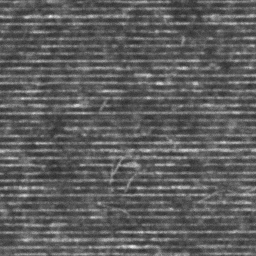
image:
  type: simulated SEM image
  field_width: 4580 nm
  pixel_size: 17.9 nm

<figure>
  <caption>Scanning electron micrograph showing parallel lines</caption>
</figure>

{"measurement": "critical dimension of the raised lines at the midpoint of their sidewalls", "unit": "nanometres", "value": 24.6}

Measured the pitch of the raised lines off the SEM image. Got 133 nanometres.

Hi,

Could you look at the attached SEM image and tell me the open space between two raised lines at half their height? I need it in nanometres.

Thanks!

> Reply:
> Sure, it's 105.